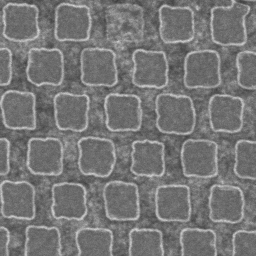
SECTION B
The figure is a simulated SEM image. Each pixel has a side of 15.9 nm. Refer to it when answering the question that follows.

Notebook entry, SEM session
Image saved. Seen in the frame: a regular array of raised bodies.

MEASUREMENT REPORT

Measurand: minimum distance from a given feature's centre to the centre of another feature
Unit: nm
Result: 807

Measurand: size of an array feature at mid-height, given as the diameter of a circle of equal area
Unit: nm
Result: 611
